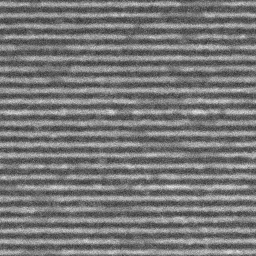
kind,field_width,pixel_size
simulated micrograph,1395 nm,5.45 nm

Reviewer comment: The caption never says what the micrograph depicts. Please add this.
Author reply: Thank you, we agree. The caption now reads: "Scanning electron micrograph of parallel lines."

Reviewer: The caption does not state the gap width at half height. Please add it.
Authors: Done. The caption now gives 6.75 pixels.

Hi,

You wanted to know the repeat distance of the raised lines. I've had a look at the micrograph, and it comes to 58.6 nanometers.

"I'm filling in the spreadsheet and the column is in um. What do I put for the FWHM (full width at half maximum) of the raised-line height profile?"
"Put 0.0184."